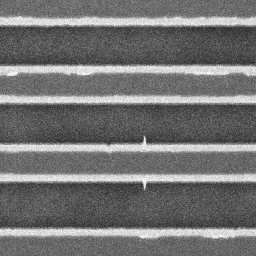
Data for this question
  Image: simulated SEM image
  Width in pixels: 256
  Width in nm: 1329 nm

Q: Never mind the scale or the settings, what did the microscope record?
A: one or a few lines or trenches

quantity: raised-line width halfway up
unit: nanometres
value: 160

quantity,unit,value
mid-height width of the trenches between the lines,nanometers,244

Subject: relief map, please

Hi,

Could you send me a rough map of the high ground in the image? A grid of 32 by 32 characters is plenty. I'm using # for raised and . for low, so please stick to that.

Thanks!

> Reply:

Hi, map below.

################################
################################
################################
................................
................................
................................
................................
................................
................................
################################
################################
################################
................................
................................
................................
................................
................................
................................
#############.##################
################################
################################
################################
................................
................................
................................
................................
................................
................................
................................
################################
################################
################################